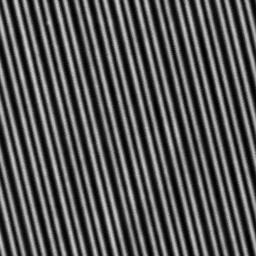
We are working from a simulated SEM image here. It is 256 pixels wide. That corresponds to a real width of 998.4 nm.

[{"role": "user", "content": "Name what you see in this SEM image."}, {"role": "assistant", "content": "parallel lines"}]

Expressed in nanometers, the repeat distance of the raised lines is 38.4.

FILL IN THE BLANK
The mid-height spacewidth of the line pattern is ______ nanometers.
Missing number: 18.5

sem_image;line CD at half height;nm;18.1